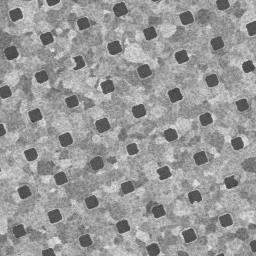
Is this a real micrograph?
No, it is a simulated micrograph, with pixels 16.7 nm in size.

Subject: a regular array of holes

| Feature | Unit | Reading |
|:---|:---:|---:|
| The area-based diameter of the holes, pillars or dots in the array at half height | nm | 237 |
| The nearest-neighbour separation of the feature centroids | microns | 0.641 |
